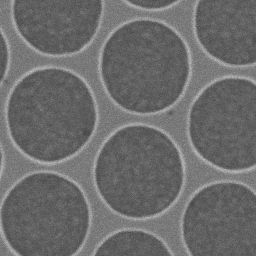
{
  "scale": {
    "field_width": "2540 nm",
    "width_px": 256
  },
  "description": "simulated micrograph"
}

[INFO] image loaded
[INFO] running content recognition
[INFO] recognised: holes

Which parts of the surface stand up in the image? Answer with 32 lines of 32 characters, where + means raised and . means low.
++...........+++.....++++.......
++...........+++++++++++........
++..........+++++.++++++........
++..........+++......+++........
+++.........++........+++.......
.+++.......++..........++.......
.++++....++++..........+++......
.++++++++++++...........+++.....
.+++++.++++++...........++++++++
+++.......+++...........++++++++
++.........++..........++++.....
++.........+++.........++.......
+...........++........+++.......
+...........+++......+++........
+...........++++++++++++........
+...........++++++++++++........
+...........+++.....++++........
++.........+++.......+++........
++........+++.........++........
++++.....+++..........+++.......
++++++++++++...........++++.....
++++++++++++...........+++++++++
+++.....++++...........+++++++++
++........++...........+++.....+
+.........+++.........++........
...........+++.......+++........
...........++++.....+++.........
...........++++++++++++.........
...........++++++++++++.........
+..........+++.....++++.........
+.........+++.......+++.........
++.......+++.........+++........